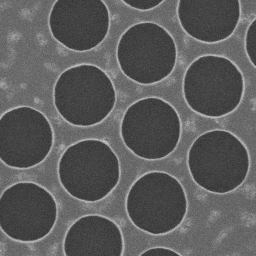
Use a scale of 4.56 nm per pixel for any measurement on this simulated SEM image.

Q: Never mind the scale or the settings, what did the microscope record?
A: holes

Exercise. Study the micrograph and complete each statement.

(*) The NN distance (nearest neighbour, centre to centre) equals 339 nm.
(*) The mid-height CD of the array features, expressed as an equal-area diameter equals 276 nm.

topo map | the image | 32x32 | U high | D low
UUUUUUUDDDDDDUUUDDDDUUDDDDDDDDUU
UUUUUUDDDDDDDDUUUUUUUUDDDDDDDDUU
UUUUUUDDDDDDDDUUUUUUUUDDDDDDDDUU
UUUUUUDDDDDDDDUUDDDDUUUDDDDDDUUD
UUUUUUUDDDDDDUUDDDDDDUUUDDDDDUUD
UUUUUUUUDDDDUUUDDDDDDDUUUUUUUUUD
UUUUUUUUUUUUUUUDDDDDDDUUUUUUUUUD
UUUUUUUUUUUUUUUDDDDDDDUUUDDDUUUD
UUUUUUUUUDDDUUUDDDDDDDUUDDDDDDUU
UUUUUUUUDDDDDUUUDDDDDUUDDDDDDDUU
UUUUUUUDDDDDDDUUUUUUUUUDDDDDDDUU
UUUUUUUDDDDDDDUUUUUUUUUDDDDDDDUU
UUUUUUUDDDDDDDUUUUDDUUUDDDDDDDUU
UUDDUUUDDDDDDDUUDDDDDDUUDDDDDUUU
DDDDDUUUDDDDDUUUDDDDDDUUUUDDUUUU
DDDDDDUUUDDDUUUDDDDDDDUUUUUUUUUU
DDDDDDUUUUUUUUUDDDDDDDDUUUDDUUUU
DDDDDDDUUUUUUUUDDDDDDDUUUDDDDDUU
DDDDDDUUUDDDDDUUDDDDDDUUDDDDDDDU
DDDDDDUUDDDDDDUUUDDDDUUUDDDDDDDU
UDDDDUUDDDDDDDDUUUUUUUUUDDDDDDDU
UUUUUUUDDDDDDDDUUUUUUUUUDDDDDDDU
UUUUUUUUDDDDDDDUUDDDDDUUDDDDDDUU
UDDDDUUUDDDDDDUUDDDDDDDUUUDDDUUU
DDDDDDUUUDDDDUUUDDDDDDDUUUUUUUUU
DDDDDDDUUUUUUUUUDDDDDDDUUUUUUUUU
DDDDDDDUUUUUUUUUDDDDDDDUUUUUUUUU
DDDDDDDUUUDDDDUUDDDDDDDUUUUUUUUU
DDDDDDUUUDDDDDDUUDDDDDUUUUUUUUUU
UDDDDDUUDDDDDDDUUUUUUUUUUUUUUUUU
UUUUUUUUDDDDDDDUUUUUUUUUUUUUUUUU
UUUUUUUUDDDDDDDUUUDDDDUUUUUUUUUU